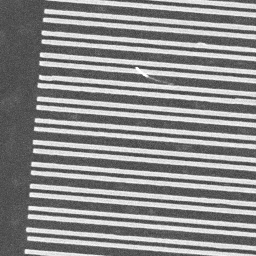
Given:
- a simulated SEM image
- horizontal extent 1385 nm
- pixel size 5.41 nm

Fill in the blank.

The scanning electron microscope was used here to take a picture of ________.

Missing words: parallel lines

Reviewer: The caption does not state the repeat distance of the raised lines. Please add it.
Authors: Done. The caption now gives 59.1 nanometers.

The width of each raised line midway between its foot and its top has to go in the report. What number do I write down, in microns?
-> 0.0229